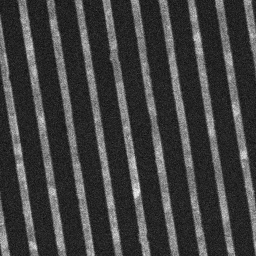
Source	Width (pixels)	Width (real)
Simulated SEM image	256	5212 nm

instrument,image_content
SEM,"parallel lines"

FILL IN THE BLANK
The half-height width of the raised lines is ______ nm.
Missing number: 133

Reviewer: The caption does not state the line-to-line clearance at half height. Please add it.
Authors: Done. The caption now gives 21.5 pixels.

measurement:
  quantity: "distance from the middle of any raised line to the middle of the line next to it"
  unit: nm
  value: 568